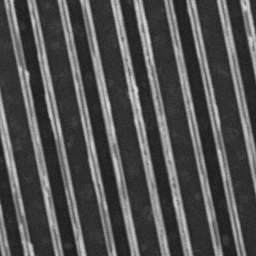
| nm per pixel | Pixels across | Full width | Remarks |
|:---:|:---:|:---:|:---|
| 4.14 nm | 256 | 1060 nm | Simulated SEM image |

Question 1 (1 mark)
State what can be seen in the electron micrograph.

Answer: parallel lines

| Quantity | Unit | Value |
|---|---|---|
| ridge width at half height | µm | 0.0315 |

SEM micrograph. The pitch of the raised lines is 0.108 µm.